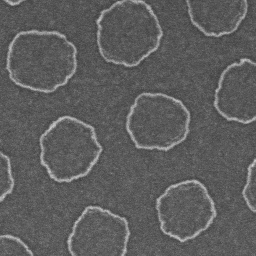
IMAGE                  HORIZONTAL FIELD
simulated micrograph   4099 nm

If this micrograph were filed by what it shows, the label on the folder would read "raised bodies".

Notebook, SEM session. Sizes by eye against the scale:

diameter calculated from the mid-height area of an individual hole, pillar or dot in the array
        945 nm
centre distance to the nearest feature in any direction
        92.7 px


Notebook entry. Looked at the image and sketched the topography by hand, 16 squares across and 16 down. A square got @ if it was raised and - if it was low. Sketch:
-------@@---@@@-
------@@@@--@@@-
-@@@--@@@@------
-@@@@--@@-------
-@@@@---------@@
--@-----------@@
--------@@@---@@
----@---@@@@---@
---@@@--@@@@----
---@@@----------
@--@@@----------
@----------@---@
----------@@@--@
-----@@---@@@---
-----@@@--@@----
@@--@@@@--------